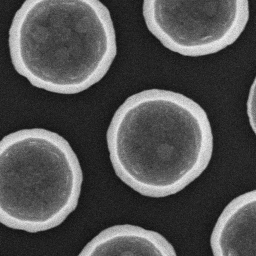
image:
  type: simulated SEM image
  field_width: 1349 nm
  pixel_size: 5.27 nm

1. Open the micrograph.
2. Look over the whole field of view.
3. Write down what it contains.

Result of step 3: raised bodies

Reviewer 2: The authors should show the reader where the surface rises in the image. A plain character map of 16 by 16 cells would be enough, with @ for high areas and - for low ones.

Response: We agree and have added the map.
--@@@@---@@@@@@-
-@@@@@@--@@@@@@-
-@@@@@@---@@@@--
-@@@@@@---------
--@@@@----------
---@@-----------
--------@@@@----
-------@@@@@@---
-@@----@@@@@@---
@@@@---@@@@@@---
@@@@@--@@@@@----
@@@@@---@@@-----
@@@@@----------@
@@@@----------@@
-------@@-----@@
------@@@@----@@